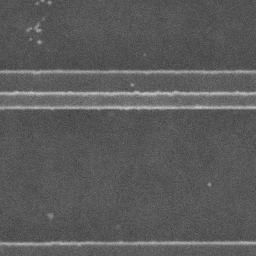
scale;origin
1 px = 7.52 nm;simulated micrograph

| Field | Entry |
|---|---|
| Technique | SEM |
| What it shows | lines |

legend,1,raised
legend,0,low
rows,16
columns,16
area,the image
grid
0000000000000000
0000000000000000
0000000000000000
0000000000000000
0000000000000000
1111111111111111
1111111111111111
0000000000000000
0000000000000000
0000000000000000
0000000000000000
0000000000000000
0000000000000000
0000000000000000
0000000000000000
1111111111111111